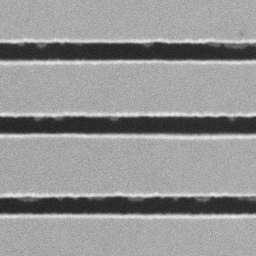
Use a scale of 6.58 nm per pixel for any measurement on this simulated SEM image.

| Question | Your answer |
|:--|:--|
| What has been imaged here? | lines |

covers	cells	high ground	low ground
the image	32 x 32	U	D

UUUUUUUUUUUUUUUUUUUUUUUUUUUUUUUU
UUUUUUUUUUUUUUUUUUUUUUUUUUUUUUUU
UUUUUUUUUUUUUUUUUUUUUUUUUUUUUUUU
UUUUUUUUUUUUUUUUUUUUUUUUUUUUUUUU
UUUUUUUUUUUUUUUUUUUUUUUUUUUUUUUU
DDDDDDDDDDDDDDDDDDDDDDDDDDDDDDDD
DDDDDDDDDDDDDDDDDDDDDDDDDDDDDDDD
DDDDDDDDDDDDDDDDDDDDDDDDDDDDDDDD
UUUUUUUUUUUUUUUUUUUUUUUUUUUUUUUU
UUUUUUUUUUUUUUUUUUUUUUUUUUUUUUUU
UUUUUUUUUUUUUUUUUUUUUUUUUUUUUUUU
UUUUUUUUUUUUUUUUUUUUUUUUUUUUUUUU
UUUUUUUUUUUUUUUUUUUUUUUUUUUUUUUU
UUUUUUUUUUUUUUUUUUUUUUUUUUUUUUUU
UUUUUUUUDDUUUUUUUUUUUDUUUUUUUUUU
DDDDDDDDDDDDDDDDDDDDDDDDDDDDDDDD
DDDDDDDDDDDDDDDDDDDDDDDDDDDDDDDD
UUUUUUUUUUUUUUUUUUUUUUUUUUUUUUUU
UUUUUUUUUUUUUUUUUUUUUUUUUUUUUUUU
UUUUUUUUUUUUUUUUUUUUUUUUUUUUUUUU
UUUUUUUUUUUUUUUUUUUUUUUUUUUUUUUU
UUUUUUUUUUUUUUUUUUUUUUUUUUUUUUUU
UUUUUUUUUUUUUUUUUUUUUUUUUUUUUUUU
UUUUUUUUUUUUUUUUUUUUUUUUUUUUUUUU
UUUUUUUUUUUUUUUUUUUUUUUUUUUUUUUU
DDDDDDDDDDDDDDDDDDDDDDDDDDDDDDDD
DDDDDDDDDDDDDDDDDDDDDDDDDDDDDDDD
UUUUUUUUUUUUUUUUUUUUUUUUUUUUUUUU
UUUUUUUUUUUUUUUUUUUUUUUUUUUUUUUU
UUUUUUUUUUUUUUUUUUUUUUUUUUUUUUUU
UUUUUUUUUUUUUUUUUUUUUUUUUUUUUUUU
UUUUUUUUUUUUUUUUUUUUUUUUUUUUUUUU